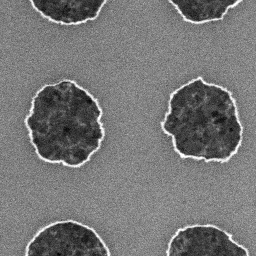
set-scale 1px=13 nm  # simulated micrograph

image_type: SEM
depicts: raised bodies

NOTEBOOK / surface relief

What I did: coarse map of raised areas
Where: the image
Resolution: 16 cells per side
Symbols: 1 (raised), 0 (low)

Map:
0011110000011100
0000000000000000
0000000000000000
0000000000000000
0000000000000000
0001100000011100
0011110000011110
0011110000111110
0011110000011110
0011110000011110
0000000000000000
0000000000000000
0000000000000000
0000000000000000
0001110000011100
0011111000011110